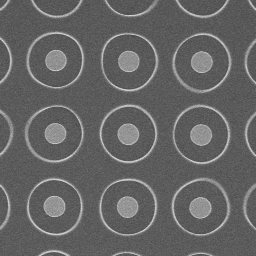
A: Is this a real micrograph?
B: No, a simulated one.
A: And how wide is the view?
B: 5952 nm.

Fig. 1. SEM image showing an array of small figures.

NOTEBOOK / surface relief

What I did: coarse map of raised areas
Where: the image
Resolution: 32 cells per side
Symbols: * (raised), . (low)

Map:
.***......****.....***......***.
*****....******...******...*****
********************************
********************************
*****...*******..*******..******
.***......***......****.....****
.***......***......***......***.
.***......***.......**.......**.
.***......***......***.......**.
.***......***......***......***.
******...*****....*****....*****
********************************
********************************
******..*******..*******..******
.***.....****......****.....****
.***......***......***......***.
.**.......***......***.......**.
.**.......***......***.......**.
.***......***......***......***.
*****....*****....*****....*****
********************************
********************************
******.******************.******
****.....*****.....****.....****
.***......***......***......***.
.***......***......***......***.
.***......***......***......***.
.***......***......***......***.
*****....*****....*****....*****
********************************
********************************
******.*************************